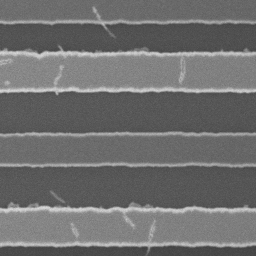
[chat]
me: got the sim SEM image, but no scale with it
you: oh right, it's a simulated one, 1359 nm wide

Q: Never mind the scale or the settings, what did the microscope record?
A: lines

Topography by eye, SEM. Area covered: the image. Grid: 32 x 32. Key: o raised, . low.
oooooooooooooooooooooooooooooooo
oooooooooooooooooooooooooooooooo
oooooooooooooooooooooooooooooooo
................................
................................
................................
ooo....oo.......oo..............
oooooooooooooooooooooooooooooooo
oooooooooooooooooooooooooooooooo
oooooooooooooooooooooooooooooooo
oooooooooooooooooooooooooooooooo
.......o......................o.
................................
................................
................................
................................
................................
oooooooooooooooooooooooooooooooo
oooooooooooooooooooooooooooooooo
oooooooooooooooooooooooooooooooo
oooooooooooooooooooooooooooooooo
................................
................................
................................
................................
................................
oooooooooooooooooooooooooooooooo
oooooooooooooooooooooooooooooooo
oooooooooooooooooooooooooooooooo
oooooooooooooooooooooooooooooooo
oooooooooooooooooooooooooooooooo
................................